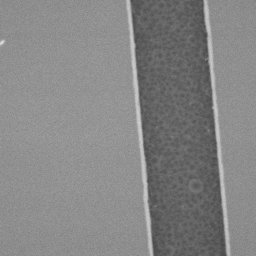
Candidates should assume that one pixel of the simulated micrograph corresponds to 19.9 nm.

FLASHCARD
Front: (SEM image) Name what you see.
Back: one or a few lines or trenches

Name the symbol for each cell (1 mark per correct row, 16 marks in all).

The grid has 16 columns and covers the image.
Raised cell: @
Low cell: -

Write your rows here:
@@@@@@@@-----@@@
@@@@@@@@-----@@@
@@@@@@@@-----@@@
@@@@@@@@-----@@@
@@@@@@@@-----@@@
@@@@@@@@-----@@@
@@@@@@@@@----@@@
@@@@@@@@@-----@@
@@@@@@@@@-----@@
@@@@@@@@@-----@@
@@@@@@@@@-----@@
@@@@@@@@@-----@@
@@@@@@@@@-----@@
@@@@@@@@@-----@@
@@@@@@@@@-----@@
@@@@@@@@@-----@@